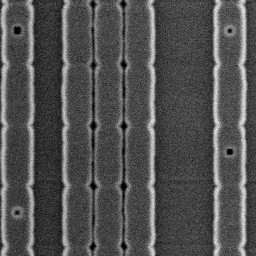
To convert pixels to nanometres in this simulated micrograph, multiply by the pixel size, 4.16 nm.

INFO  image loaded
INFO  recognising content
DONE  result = wiring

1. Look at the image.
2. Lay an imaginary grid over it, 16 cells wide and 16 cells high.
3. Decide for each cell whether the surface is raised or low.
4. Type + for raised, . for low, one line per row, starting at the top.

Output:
++..++++++...++.
++..++++++...++.
++..++++++...++.
++..++++++...++.
++..++++++...++.
++..++++++...++.
++..++++++...++.
++..++++++...++.
++..++++++...++.
++..++++++...++.
++..++++++...++.
++..++++++...++.
++..++++++...++.
++..++++++...++.
++..++++++...++.
++..++++++...++.